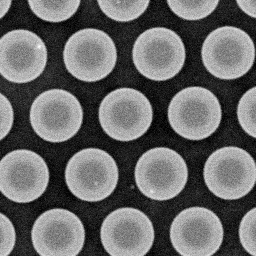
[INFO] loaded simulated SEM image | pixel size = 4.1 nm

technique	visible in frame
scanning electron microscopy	an array of small figures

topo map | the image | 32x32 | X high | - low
X---XXXXXX--XXXXXX---XXXXXX---XX
X---XXXXX----XXXXX----XXXX-----X
------XX-------X----------------
-------------------X--------X---
-XXXX----XXXX-----XXXX----XXXXX-
XXXXX---XXXXXX---XXXXXX--XXXXXXX
XXXXXX--XXXXXX---XXXXXX--XXXXXXX
XXXXXX--XXXXXX---XXXXXX--XXXXXXX
XXXXX---XXXXXX---XXXXXX---XXXXX-
XXXXX----XXXX-----XXXX-----XXX--
--------------------------------
------XX------XXX-----XXXX-----X
X---XXXXXX---XXXXX----XXXXX---XX
X---XXXXXX--XXXXXXX--XXXXXXX--XX
XX--XXXXXX--XXXXXXX--XXXXXXX--XX
X---XXXXXX---XXXXXX--XXXXXX---XX
X----XXXXX---XXXXX----XXXXX----X
------XX-------X----------------
----------------------------XX--
-XXXX----XXXXX----XXXX----XXXXX-
XXXXXX--XXXXXX---XXXXXX---XXXXXX
XXXXXX--XXXXXXX--XXXXXX---XXXXXX
XXXXXX--XXXXXXX--XXXXXX---XXXXXX
XXXXXX---XXXXX---XXXXXX---XXXXX-
-XXXX-----XXX-----XXXX-----XXX--
--------------------------------
------XXX-----XXXX-----XXX-----X
X----XXXXX---XXXXXX---XXXXX---XX
XX--XXXXXX---XXXXXX--XXXXXXX--XX
XX--XXXXXX---XXXXXX--XXXXXXX--XX
XX--XXXXXX---XXXXXX---XXXXXX--XX
X----XXXXX----XXXX----XXXXX----X